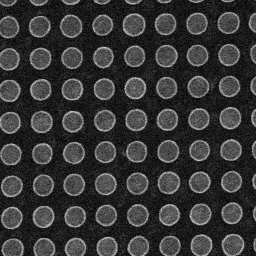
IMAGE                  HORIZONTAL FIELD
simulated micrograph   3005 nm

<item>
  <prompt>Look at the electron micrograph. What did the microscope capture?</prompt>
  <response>a regular array of raised bodies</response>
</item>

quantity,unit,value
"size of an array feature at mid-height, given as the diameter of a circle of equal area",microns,0.237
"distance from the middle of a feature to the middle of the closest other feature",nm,367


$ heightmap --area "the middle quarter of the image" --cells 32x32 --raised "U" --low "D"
UUUUDDDDDUUDDDDDDDDDDDDDDUDDDDDD
DDDDDDDDDDDDDDDDDDDDDDDDDDDDDDDD
DDDDDDDDDDDDDDDDDDDDDDDDDDDDDDDD
DDDDDDDDDDDDDDDDDDDDDDDDDDDDDDDD
DUUUDDDDUUUUDDDDUUUUDDDDUUUUDDDD
UUUUDDDDUUUUDDDDUUUUDDDUUUUUDDDU
UUUUDDDDUUUUDDDUUUUUDDDUUUUUDDDU
UUUUDDDDUUUUDDDDUUUUDDDDUUUDDDDD
DUUUDDDDDUUDDDDDDDDDDDDDDUDDDDDD
DDDDDDDDDDDDDDDDDDDDDDDDDDDDDDDD
DDDDDDDDDDDDDDDDDDDDDDDDDDDDDDDD
DDDDDDDDDDDDDDDDDDDDDDDDDUDDDDDD
DUUUDDDDDUUUDDDDUUUUDDDDUUUUDDDD
UUUUUDDDUUUUUDDDUUUUDDDDUUUUDDDU
UUUUUDDDUUUUUDDDUUUUDDDDUUUUDDDU
UUUUDDDDUUUUDDDDUUUUDDDDUUUUDDDD
DUUUDDDDDUUDDDDDDDDDDDDDDDDDDDDD
DDDDDDDDDDDDDDDDDDDDDDDDDDDDDDDD
DDDDDDDDDDDDDDDDDDDDDDDDDDDDDDDD
DDDDDDDDDDDDDDDDDDDDDDDDDUUDDDDD
DUUUDDDDUUUUDDDDUUUUDDDDUUUUDDDD
UUUUUDDDUUUUUDDDUUUUDDDDUUUUUDDD
UUUUUDDDUUUUUDDDUUUUDDDDUUUUUDDD
UUUUUDDDUUUUDDDDUUUUDDDDUUUUDDDD
DDUUDDDDDDDDDDDDDDDDDDDDDDDDDDDD
DDDDDDDDDDDDDDDDDDDDDDDDDDDDDDDD
DDDDDDDDDDDDDDDDDDDDDDDDDDDDDDDD
DDDDDDDDDDDDDDDDDDUDDDDDDUUDDDDD
DUUUDDDDUUUUDDDDUUUUUDDDUUUUUDDD
UUUUUDDDUUUUUDDDUUUUUDDDUUUUUDDU
UUUUUDDDUUUUUDDDUUUUUDDDUUUUUDDD
UUUUUDDDUUUUUDDDUUUUDDDDUUUUDDDD